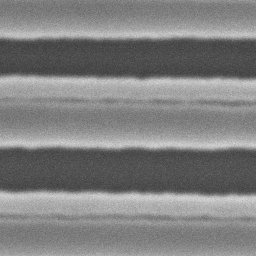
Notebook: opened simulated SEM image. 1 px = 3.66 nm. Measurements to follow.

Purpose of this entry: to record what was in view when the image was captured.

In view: lines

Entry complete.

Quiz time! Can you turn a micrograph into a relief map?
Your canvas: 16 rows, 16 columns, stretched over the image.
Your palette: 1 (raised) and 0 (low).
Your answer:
1111111111111111
1111111111111111
0000000000000000
0000000000000000
0000000000000000
1111111111111111
1111111111111111
1111111111111111
1111111111111111
0000000000000000
0000000000000000
0000000000000000
1111111111111111
1111111111111111
1111111111111111
1111111111111111